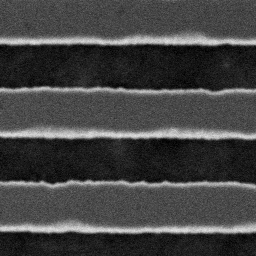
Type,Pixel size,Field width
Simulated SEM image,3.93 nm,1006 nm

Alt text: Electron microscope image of lines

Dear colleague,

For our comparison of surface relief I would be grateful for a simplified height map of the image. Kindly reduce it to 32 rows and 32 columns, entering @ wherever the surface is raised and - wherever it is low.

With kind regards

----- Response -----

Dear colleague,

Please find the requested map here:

@@@@@@@@@@@@@@@@@@@@@@@@@@@@@@@@
@@@@@@@@@@@@@@@@@@@@@@@@@@@@@@@@
@@@@@@@@@@@@@@@@@@@@@@@@@@@@@@@@
@@@@@@@@@@@@@@@@@@@@@@@@@@@@@@@@
@@@@@@@@@@@@@@@@@@@@@@@@@@@@@@@@
-@--@-------@@@-----@----@@@-@@@
--------------------------------
--------------------------------
--------------------------------
--------------------------------
--------------------------------
@@@@@@@@@@@@@@@@@@@@@@@@@@@@@@@@
@@@@@@@@@@@@@@@@@@@@@@@@@@@@@@@@
@@@@@@@@@@@@@@@@@@@@@@@@@@@@@@@@
@@@@@@@@@@@@@@@@@@@@@@@@@@@@@@@@
@@@@@@@@@@@@@@@@@@@@@@@@@@@@@@@@
@@@@@@@@@@@@@@@@@@@@@@@@@@@@@@@@
--------------------------------
--------------------------------
--------------------------------
--------------------------------
--------------------------------
--------------------------------
@@@@@@@@@@@@@@@@@@@@@@@@@@@@@@@@
@@@@@@@@@@@@@@@@@@@@@@@@@@@@@@@@
@@@@@@@@@@@@@@@@@@@@@@@@@@@@@@@@
@@@@@@@@@@@@@@@@@@@@@@@@@@@@@@@@
@@@@@@@@@@@@@@@@@@@@@@@@@@@@@@@@
@@@@@@@@@@@@@@@@@@@@@@@@@@@@@@@@
--------------------------------
--------------------------------
--------------------------------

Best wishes